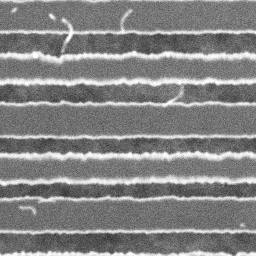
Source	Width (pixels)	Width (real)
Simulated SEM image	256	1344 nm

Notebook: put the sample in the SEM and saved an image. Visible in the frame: lines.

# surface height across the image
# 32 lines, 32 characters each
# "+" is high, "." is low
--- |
++++++++++++++++++++++++++++++++
++++++++++++++++++++++++++++++++
++++++++++++++++++++++++++++++++
++++++++++++++++++++++++++++++++
................................
................................
................................
++++++++++++++++++++++++++++++++
++++++++++++++++++++++++++++++++
++++++++++++++++++++++++++++++++
........+...+......+............
................................
................................
++++++++++++++++++++++++++++++++
++++++++++++++++++++++++++++++++
++++++++++++++++++++++++++++++++
++++++++++++++++++++++++++++++++
................................
................................
++++++++++++++++++++++++++++++++
++++++++++++++++++++++++++++++++
++++++++++++++++++++++++++++++++
++++++++++++++++++++++++++++++++
................................
................................
++++++++++++++++++++++++++++++++
++++++++++++++++++++++++++++++++
++++++++++++++++++++++++++++++++
++++++++++++++++++++++++++++++++
................................
................................
................................